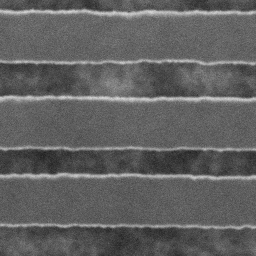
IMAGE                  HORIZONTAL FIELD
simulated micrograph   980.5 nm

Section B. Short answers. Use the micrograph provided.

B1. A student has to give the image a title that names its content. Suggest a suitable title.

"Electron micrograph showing lines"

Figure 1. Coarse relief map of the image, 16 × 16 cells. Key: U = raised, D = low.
DDDDDDDDDDDDDDDD
UUUUUUUUUUUUUUUU
UUUUUUUUUUUUUUUU
UUUUUUUUUUUUUUUU
DDDDDDDDDDDDDDDD
DDDDDDDDDDDDDDDD
UUUUUUUUUUUUUUUU
UUUUUUUUUUUUUUUU
UUUUUUUUUUUUUUUU
DDDDDDDDDDDDDDDD
DDDDDDDDDDDDDDDD
UUUUUUUUUUUUUUUU
UUUUUUUUUUUUUUUU
UUUUUUUUUUUUUUUU
DDDDDDDDDDDDDDDD
DDDDDDDDDDDDDDDD